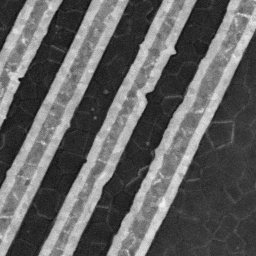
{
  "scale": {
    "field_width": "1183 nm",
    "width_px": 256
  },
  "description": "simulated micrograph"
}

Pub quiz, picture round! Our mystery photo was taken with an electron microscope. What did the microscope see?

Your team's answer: one or a few lines or trenches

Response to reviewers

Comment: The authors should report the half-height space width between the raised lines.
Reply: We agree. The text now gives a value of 0.188 um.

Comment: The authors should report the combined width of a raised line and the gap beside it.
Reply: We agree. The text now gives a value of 289 nm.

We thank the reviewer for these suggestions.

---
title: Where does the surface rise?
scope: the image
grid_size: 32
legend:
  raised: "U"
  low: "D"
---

DDDDUUUDDDDDUUUDDDDDDUUUDDDDDUUU
DDDUUUDDDDDDUUUDDDDDUUUDDDDDDUUU
DDDUUUDDDDDUUUDDDDDDUUUDDDDDDUUU
DDUUUDDDDDDUUUDDDDDUUUDDDDDDUUUD
DDUUUDDDDDUUUDDDDDDUUUDDDDDDUUUD
DUUUDDDDDDUUUDDDDDUUUDDDDDDUUUDD
DUUUDDDDDUUUDDDDDDUUUDDDDDDUUUDD
UUUDDDDDDUUUDDDDDDUUDDDDDDUUUDDD
UUUDDDDDUUUDDDDDDUUUDDDDDUUUUDDD
UUDDDDDDUUUDDDDDDUUDDDDDDUUUDDDD
UUDDDDDUUUDDDDDDUUUDDDDDDUUUDDDD
UDDDDDDUUUDDDDDUUUDDDDDDUUUDDDDD
UDDDDDUUUDDDDDDUUUDDDDDDUUUDDDDD
DDDDDDUUUDDDDDUUUDDDDDDUUUDDDDDD
DDDDDUUUDDDDDDUUUDDDDDUUUUDDDDDD
DDDDDUUUDDDDDDUUDDDDDDUUUDDDDDDD
DDDDUUUDDDDDDUUUDDDDDUUUUDDDDDDD
DDDDUUUDDDDDDUUDDDDDDUUUDDDDDDDD
DDDUUUDDDDDDUUUDDDDDDUUUDDDDDDDD
DDDUUUDDDDDDUUDDDDDDUUUDDDDDDDDD
DDUUUDDDDDDUUUDDDDDDUUUDDDDDDDDD
DDUUUDDDDDDUUUDDDDDUUUUDDDDDDDDD
DUUUUDDDDDUUUDDDDDDUUUDDDDDDDDDD
DUUUDDDDDDUUDDDDDDUUUUDDDDDDDDDD
UUUUDDDDDUUUDDDDDDUUUDDDDDDDDDDD
UUUDDDDDDUUDDDDDDUUUUDDDDDDDDDDD
UUUDDDDDUUUDDDDDDUUUDDDDDDDDDDDD
UUDDDDDDUUDDDDDDUUUUDDDDDDDDDDDD
UUDDDDDUUUDDDDDDUUUDDDDDDDDDDDDD
UDDDDDDUUDDDDDDUUUUDDDDDDDDDDDDD
UDDDDDUUUDDDDDDUUUDDDDDDDDDDDDDD
DDDDDDUUUDDDDDUUUUDDDDDDDDDDDDDD